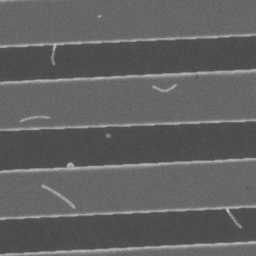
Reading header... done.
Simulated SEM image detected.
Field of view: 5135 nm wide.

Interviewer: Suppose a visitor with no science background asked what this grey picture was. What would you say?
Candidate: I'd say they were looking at lines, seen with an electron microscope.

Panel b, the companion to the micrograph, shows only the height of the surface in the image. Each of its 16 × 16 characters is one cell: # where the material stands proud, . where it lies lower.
################
################
##########......
................
..............##
################
################
################
................
................
....############
################
################
####............
................
........########